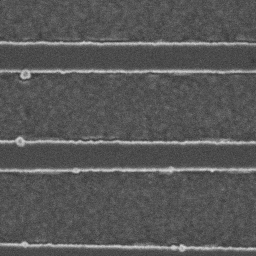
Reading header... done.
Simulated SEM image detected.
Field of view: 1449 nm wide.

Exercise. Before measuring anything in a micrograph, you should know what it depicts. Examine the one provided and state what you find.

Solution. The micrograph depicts lines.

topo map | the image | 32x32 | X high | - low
--------------------------------
--------------------------------
------XX------------------------
--------------------------------
--------------------------------
XXXXXXXXXXXXXXXXXXXXXXXXXXXXXXXX
XXXXXXXXXXXXXXXXXXXXXXXXXXXXXXXX
XXXXXXXXXXXXXXXXXXXXXXXXXXXXXXXX
XXXXXXXXXXXXXXXXXXXXXXXXXXXXXXXX
---X----------------------------
--------------------------------
--------------------------------
--------------------------------
--------------------------------
--------------------------------
--------------------------------
--------------------------------
--X-----------------------------
XXXXXXXXXXXXXXXXXXXXXXXXXXXXXXXX
XXXXXXXXXXXXXXXXXXXXXXXXXXXXXXXX
XXXXXXXXXXXXXXXXXXXXXXXXXXXXXXXX
---------X----------------------
--------------------------------
--------------------------------
--------------------------------
--------------------------------
--------------------------------
--------------------------------
--------------------------------
--------------------------------
--XX----------------------------
XXXXXXXXXXXXXXXXXXXXXXXXXXXXXXXX